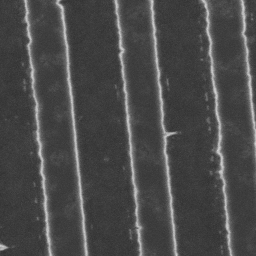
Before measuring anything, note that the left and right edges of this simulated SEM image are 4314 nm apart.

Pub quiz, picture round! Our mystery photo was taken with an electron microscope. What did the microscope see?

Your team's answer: one or a few lines or trenches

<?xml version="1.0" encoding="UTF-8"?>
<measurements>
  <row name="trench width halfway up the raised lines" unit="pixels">53.9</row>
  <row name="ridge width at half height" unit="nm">602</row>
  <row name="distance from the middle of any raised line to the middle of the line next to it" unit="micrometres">1.51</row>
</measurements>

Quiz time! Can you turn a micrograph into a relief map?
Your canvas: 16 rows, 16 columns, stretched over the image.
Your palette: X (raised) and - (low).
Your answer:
--XX---XXX---XX-
--XX---XXX---XX-
--XX----XX---XX-
--XX----XX---XX-
--XX----XX---XXX
--XX----XX---XXX
--XXX---XX----XX
--XXX---XX----XX
--XXX---XX----XX
---XX---XX----XX
---XX---XX----XX
---XX---XXX---XX
---XX---XXX---XX
---XX----XX---XX
---XX----XX---XX
---XX----XX---XX